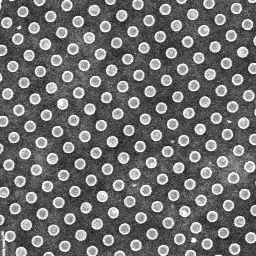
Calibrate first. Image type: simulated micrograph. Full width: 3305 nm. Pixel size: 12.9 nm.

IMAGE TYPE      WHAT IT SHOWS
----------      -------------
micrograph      a regular array of raised bodies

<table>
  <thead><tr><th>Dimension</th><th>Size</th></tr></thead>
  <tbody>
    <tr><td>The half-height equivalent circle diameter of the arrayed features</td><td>137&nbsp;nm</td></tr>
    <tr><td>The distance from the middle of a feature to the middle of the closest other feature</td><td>253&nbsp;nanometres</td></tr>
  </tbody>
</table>